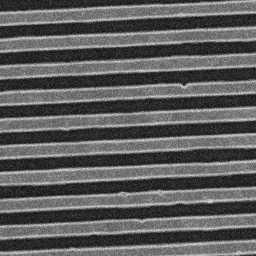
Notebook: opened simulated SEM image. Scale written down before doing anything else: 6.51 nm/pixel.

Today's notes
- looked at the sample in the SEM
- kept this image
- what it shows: parallel lines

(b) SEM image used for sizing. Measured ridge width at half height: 74.8 nm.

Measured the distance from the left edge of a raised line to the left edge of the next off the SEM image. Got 0.174 um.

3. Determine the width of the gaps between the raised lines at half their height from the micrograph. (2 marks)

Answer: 99.2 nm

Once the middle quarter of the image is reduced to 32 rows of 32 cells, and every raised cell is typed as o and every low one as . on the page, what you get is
oooooooooooooooooooooooooooooooo
ooooooooooooooooooooooo.........
oo..............................
................................
................................
........................ooooo..o
...ooooooooooooooooooooooooooooo
oooooooooooooooooooooooooooooooo
oooooooooooooo.oo...............
................................
................................
................................
.................ooooooooooooooo
oooooooooooooooooooooooooooooooo
ooooooooooooooooooooooooooooooo.
oooooooooo......................
................................
................................
................................
...........ooooooooooooooooooooo
oooooooooooooooooooooooooooooooo
ooooooooooooooooooooooooo.......
oooo............................
................................
................................
.........................ooooooo
oooooooooooooooooooooooooooooooo
oooooooooooooooooooooooooooooooo
oooooooooooooooooo..............
................................
................................
................................